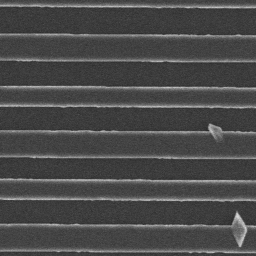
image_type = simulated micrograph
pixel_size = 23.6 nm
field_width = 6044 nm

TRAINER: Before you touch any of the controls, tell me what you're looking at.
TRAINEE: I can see lines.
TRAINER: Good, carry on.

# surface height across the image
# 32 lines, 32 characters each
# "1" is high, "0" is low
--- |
11111111111111111111111111111111
00000000000000000000000000000000
00000000000000000000000000000000
00000000000000000000000000000000
11111111111111111111111111100110
11111111111111111111111111111111
11111111111111111111111111111111
00111111111111111111111111111111
00000000000000000000000000000000
00000000000000000000000000000000
00000000000000000000000000000000
11111111111111111111111111111111
11111111111111111111111111111111
00000000000000000000000000000000
00000000000000000000000000000000
00000000000000000000000000000000
11111111111111111111111111111111
11111111111111111111111111111111
11111111111111111111111111111111
11111111111111111111111111111111
00000000000000000000000000000000
00000000000000000000000000000000
11111111111110000000000000000000
11111111111111111111111111111111
11111111111111111111111111111111
00000000000000000000000000000000
00000000000000000000000000000000
00000000000000000000000000000100
11111111111111111111111111111111
11111111111111111111111111111111
11111111111111111111111111111111
00000000000000000000000011101111